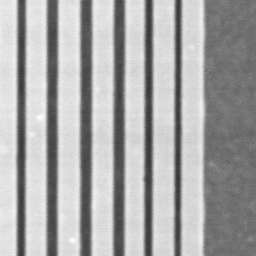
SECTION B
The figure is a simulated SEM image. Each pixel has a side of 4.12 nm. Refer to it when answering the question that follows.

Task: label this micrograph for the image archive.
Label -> parallel lines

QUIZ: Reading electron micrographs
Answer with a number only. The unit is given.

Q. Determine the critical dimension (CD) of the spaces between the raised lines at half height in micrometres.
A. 0.044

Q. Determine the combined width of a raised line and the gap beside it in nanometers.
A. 129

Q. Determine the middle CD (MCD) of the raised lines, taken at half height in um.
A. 0.0875